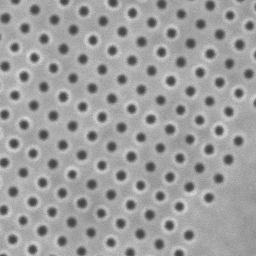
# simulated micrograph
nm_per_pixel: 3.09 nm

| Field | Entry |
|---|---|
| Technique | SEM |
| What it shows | a regular array of holes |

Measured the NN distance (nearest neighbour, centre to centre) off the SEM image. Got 65.6 nanometers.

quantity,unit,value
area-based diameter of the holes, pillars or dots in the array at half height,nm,30.4